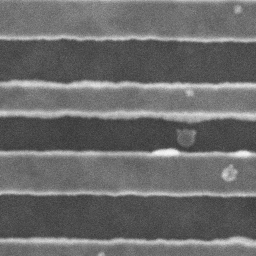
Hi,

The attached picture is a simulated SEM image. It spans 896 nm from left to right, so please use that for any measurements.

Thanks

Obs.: lines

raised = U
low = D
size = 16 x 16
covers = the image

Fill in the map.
UUUUUUUUUUUUUUUU
UUUUUUUUUUUUUUUU
DDDDDDDDDDDUUUUU
DDDDDDDDDDDDDDDD
DDDDDDDDDDDDDDDD
UUUUUUUUUUUUUUUU
UUUUUUUUUUUUUUUU
DDDDDDDDDDDDDDDD
DDDDDDDDDDDDDDDD
DDDDDDDDDDUDDDDU
UUUUUUUUUUUUUUUU
UUUUUUUUUUUUUUUU
DDDDDDDDDDDDDDDD
DDDDDDDDDDDDDDDD
DDDDDDDDDDDDDDDD
UUUUUUUUUUUUUUUU